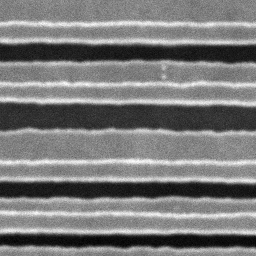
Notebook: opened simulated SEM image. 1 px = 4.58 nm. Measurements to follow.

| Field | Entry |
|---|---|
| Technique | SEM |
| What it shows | lines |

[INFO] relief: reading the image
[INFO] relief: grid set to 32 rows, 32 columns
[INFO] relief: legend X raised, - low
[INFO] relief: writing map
XXXXXXXXXXXXXXXXXXXXXXXXXXXXXXXX
XXXXXXXXXXXXXXXXXXXXXXXXXXXXXXXX
XXXXXXXXXXXXXXXXXXXXXXXXXXXXXXXX
XXXXXXXXXXXXXXXXXXXXXXXXXXXXXXXX
XXXXXXXXXXXXXXXXXXXXXXXXXXXXXXXX
--------------------------------
--------------------------------
--------------------------------
XXXXXXXXXXXXXXXXXXXXXXXXXXXXXXXX
XXXXXXXXXXXXXXXXXXXXXXXXXXXXXXXX
XXXXXXXXXXXXXXXXXXXXXXXXXXXXXXXX
XXXXXXXXXXXXXXXXXXXXXXXXXXXXXXXX
XXXXXXXXXXXXXXXXXXXXXXXXXXXXXXXX
--------------------------------
--------------------------------
--------------------------------
-XXXXXXXXXXXXXXXXXXXXX-X-X--XXX-
XXXXXXXXXXXXXXXXXXXXXXXXXXXXXXXX
XXXXXXXXXXXXXXXXXXXXXXXXXXXXXXXX
XXXXXXXXXXXXXXXXXXXXXXXXXXXXXXXX
XXXXXXXXXXXXXXXXXXXXXXXXXXXXXXXX
XXXXXXXXXXXXXXXXXXXXXXXXXXXXXXXX
XXXXXXXXXXXXXXXXXXXXXXXXXXXXXXXX
--------------------------------
--------------------------------
XXXXXXXXXXXXXXXXXXXXXXXXXXXXXXXX
XXXXXXXXXXXXXXXXXXXXXXXXXXXXXXXX
XXXXXXXXXXXXXXXXXXXXXXXXXXXXXXXX
XXXXXXXXXXXXXXXXXXXXXXXXXXXXXXXX
--------------------------------
--------------------------------
XXXXXXXXXXXXXXXXXXXXXXXXXXXXXXXX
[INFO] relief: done